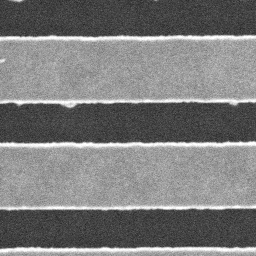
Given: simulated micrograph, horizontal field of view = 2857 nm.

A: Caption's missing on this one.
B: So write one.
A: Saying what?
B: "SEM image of lines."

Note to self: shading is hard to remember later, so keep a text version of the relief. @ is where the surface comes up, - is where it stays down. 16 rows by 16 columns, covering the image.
----------------
----------------
@@@@@@@@@@@@@@@@
@@@@@@@@@@@@@@@@
@@@@@@@@@@@@@@@@
@@@@@@@@@@@@@@@@
----------------
----------------
----------------
@@@@@@@@@@@@@@@@
@@@@@@@@@@@@@@@@
@@@@@@@@@@@@@@@@
@@@@@@@@@@@@@@@@
----------------
----------------
-@@---@-@@@@@@@@